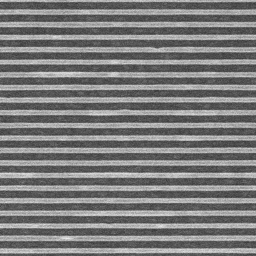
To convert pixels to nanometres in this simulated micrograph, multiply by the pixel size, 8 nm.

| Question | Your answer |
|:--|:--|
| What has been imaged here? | parallel lines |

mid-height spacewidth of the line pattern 63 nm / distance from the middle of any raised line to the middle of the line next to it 100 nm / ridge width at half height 0.038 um